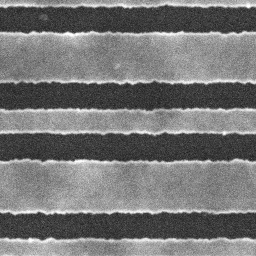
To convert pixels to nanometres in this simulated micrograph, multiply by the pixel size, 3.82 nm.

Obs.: lines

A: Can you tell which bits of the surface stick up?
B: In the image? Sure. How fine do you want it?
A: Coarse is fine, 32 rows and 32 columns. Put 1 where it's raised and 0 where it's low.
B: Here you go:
11111111111111111111111111111111
00000000000000000000000000000000
00000000000000000000000000000000
00000000000000000000000000000000
11111111111111111111111111111111
11111111111111111111111111111111
11111111111111111111111111111111
11111111111111111111111111111111
11111111111111111111111111111111
11111111111111111111111111111111
00000000000000000000000000000000
00000000000000000000000000000000
00000000000000000000000000000000
00000000000000000000000000000000
11111111111111111111111111111111
11111111111111111111111111111111
11111111111111111111111111111111
00000000000000000000000000000000
00000000000000000000000000000000
00000000000000000000000000000000
11111111111111111111111111111111
11111111111111111111111111111111
11111111111111111111111111111111
11111111111111111111111111111111
11111111111111111111111111111111
11111111111111111111111111111111
11111111111111011111010100111110
00000000000000000000000000000000
00000000000000000000000000000000
00000000000000000000000000000000
11111111111111111111111111111111
11111111111111111111111111111111